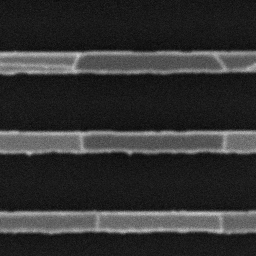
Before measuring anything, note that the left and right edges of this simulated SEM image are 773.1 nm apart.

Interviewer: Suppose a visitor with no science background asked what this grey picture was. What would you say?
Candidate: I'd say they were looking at lines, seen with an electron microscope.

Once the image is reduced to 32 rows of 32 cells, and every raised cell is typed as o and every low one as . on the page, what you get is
................................
................................
................................
................................
................................
................................
................................
oooooooooooooooooooooooooooooooo
oooooooooooooooooooooooooooooooo
................................
................................
................................
................................
................................
................................
................................
.oo........ooo......oo.ooooooooo
oooooooooooooooooooooooooooooooo
oooooooooooooooooooooooooooooooo
................................
................................
................................
................................
................................
................................
................................
...............................o
oooooooooooooooooooooooooooooooo
oooooooooooooooooooooooooooooooo
................................
................................
................................